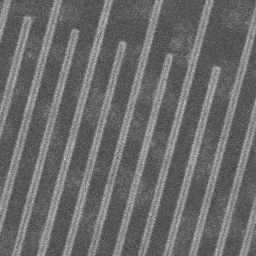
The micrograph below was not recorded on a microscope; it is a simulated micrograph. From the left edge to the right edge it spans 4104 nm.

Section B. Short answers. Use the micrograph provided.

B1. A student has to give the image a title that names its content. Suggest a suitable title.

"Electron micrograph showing parallel lines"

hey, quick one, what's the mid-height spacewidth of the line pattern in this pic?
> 310 nm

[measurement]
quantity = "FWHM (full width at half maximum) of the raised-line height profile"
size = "83.3 nm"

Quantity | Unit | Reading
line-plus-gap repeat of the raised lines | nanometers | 391